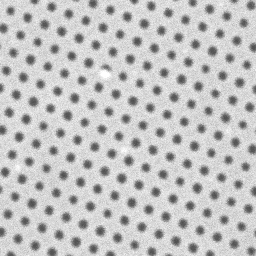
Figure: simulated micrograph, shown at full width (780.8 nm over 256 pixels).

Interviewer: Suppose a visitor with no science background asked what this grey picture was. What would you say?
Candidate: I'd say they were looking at a regular array of holes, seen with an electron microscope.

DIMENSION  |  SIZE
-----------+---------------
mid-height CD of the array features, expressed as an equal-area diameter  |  30.8 nm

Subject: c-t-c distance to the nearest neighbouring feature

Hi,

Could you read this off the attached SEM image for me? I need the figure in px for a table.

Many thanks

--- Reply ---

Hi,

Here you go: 18.3